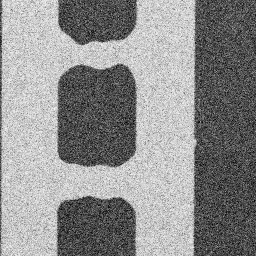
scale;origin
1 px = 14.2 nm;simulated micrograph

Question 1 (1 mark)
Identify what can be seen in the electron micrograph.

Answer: one or a few lines or trenches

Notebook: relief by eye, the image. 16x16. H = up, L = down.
HHHHLLLLLHHHLLLL
HHHHLLLLHHHHLLLL
HHHHHLLLHHHHLLLL
HHHHHHHHHHHHLLLL
HHHHLLLLHHHHLLLL
HHHHLLLLLHHHLLLL
HHHHLLLLLHHHLLLL
HHHHLLLLLHHHLLLL
HHHHLLLLLHHHLLLL
HHHHLLLLHHHHLLLL
HHHHHHHHHHHHLLLL
HHHHHHHHHHHHLLLL
HHHHLLLLHHHHLLLL
HHHHLLLLHHHHLLLL
HHHHLLLLLHHHLLLL
HHHHLLLLLHHHLLLL